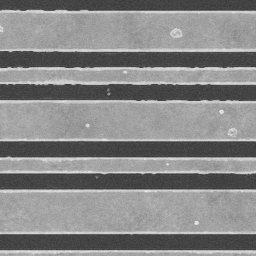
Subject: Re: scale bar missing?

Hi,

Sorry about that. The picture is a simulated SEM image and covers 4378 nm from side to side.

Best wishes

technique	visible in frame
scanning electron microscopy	lines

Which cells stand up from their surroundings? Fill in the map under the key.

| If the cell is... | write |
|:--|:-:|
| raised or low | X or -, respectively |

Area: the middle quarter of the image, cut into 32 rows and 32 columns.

--------------------------------
XXXXXXXXXXXXXXXXXXXXXXXXXXXXXXXX
XXXXXXXXXXXXXXXXXXXXXXXXXXXXXXXX
XXXXXXXXXXXXXXXXXXXXXXXXXXXXXXXX
XXXXXXXXXXXXXXXXXXXXXXXXXXXXXXXX
--------------------------------
--------------------------------
--------------------------------
--------------------------------
XXXXXXXXXXXXXXXXXXXXXXXXXXXXXXXX
XXXXXXXXXXXXXXXXXXXXXXXXXXXXXXXX
XXXXXXXXXXXXXXXXXXXXXXXXXXXXXXXX
XXXXXXXXXXXXXXXXXXXXXXXXXXXXXXXX
XXXXXXXXXXXXXXXXXXXXXXXXXXXXXXXX
XXXXXXXXXXXXXXXXXXXXXXXXXXXXXXXX
XXXXXXXXXXXXXXXXXXXXXXXXXXXXXXXX
XXXXXXXXXXXXXXXXXXXXXXXXXXXXXXXX
XXXXXXXXXXXXXXXXXXXXXXXXXXXXXXXX
XXXXXXXXXXXXXXXXXXXXXXXXXXXXXXXX
--------------------------------
--------------------------------
--------------------------------
--------------------------------
--------------------------------
XXXXXXXXXXXXXXXXXXXXXXXXXXXXXXXX
XXXXXXXXXXXXXXXXXXXXXXXXXXXXXXXX
XXXXXXXXXXXXXXXXXXXXXXXXXXXXXXXX
--------------------------------
--------------------------------
--------------------------------
--------------------------------
--------------------------------